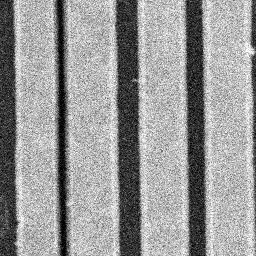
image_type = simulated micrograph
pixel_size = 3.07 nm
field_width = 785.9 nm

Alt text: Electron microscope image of one or a few lines or trenches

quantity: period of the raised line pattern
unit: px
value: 63.9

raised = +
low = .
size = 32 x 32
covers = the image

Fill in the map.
..+++++.++++++....+++++...+++++.
..+++++.++++++....+++++...+++++.
..+++++.++++++....+++++...+++++.
..+++++.++++++....+++++...+++++.
..+++++.++++++....+++++...+++++.
..+++++..+++++....+++++...+++++.
..+++++.++++++....+++++...+++++.
..+++++.++++++....+++++...+++++.
..+++++.++++++....+++++...+++++.
..+++++.++++++....+++++...+++++.
..+++++.++++++....+++++...+++++.
..+++++.++++++....+++++...+++++.
..+++++..+++++....+++++...+++++.
..+++++..+++++....+++++...+++++.
..+++++..+++++....+++++...+++++.
..+++++..+++++....+++++...+++++.
..+++++..+++++....+++++...+++++.
..+++++..+++++....+++++...+++++.
..+++++..+++++....+++++...+++++.
..+++++..+++++....+++++...+++++.
..+++++..+++++....+++++...+++++.
..+++++..+++++....+++++...+++++.
..+++++..+++++....+++++...+++++.
..+++++..+++++....+++++...+++++.
..+++++..+++++....+++++...+++++.
..+++++..+++++....+++++...+++++.
..+++++..+++++....+++++...+++++.
...++++..+++++....+++++...+++++.
...++++..+++++....+++++...+++++.
...++++..+++++....+++++...+++++.
..+++++..+++++....+++++...+++++.
...++++..+++++....+++++...+++++.